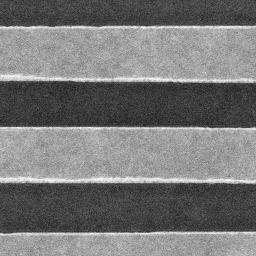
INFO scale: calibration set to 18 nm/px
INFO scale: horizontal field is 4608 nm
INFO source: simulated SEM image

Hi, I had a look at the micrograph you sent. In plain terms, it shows lines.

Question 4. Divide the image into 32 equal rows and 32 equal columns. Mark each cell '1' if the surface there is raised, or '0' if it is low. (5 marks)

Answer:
00000000000000000000000000000000
00000000000000000000000000000000
00000000000000000000000000000000
11111111111111111111111111111111
11111111111111111111111111111111
11111111111111111111111111111111
11111111111111111111111111111111
11111111111111111111111111111111
11111111111111111111111111111111
11111111111111111111111111111111
00000000000000000000000000000000
00000000000000000000000000000000
00000000000000000000000000000000
00000000000000000000000000000000
00000000000000000000000000000000
00000000000000000000000000000000
11111111111111111111111111111111
11111111111111111111111111111111
11111111111111111111111111111111
11111111111111111111111111111111
11111111111111111111111111111111
11111111111111111111111111111111
11111111111111111111111111111111
00000000000000000000000000000000
00000000000000000000000000000000
00000000000000000000000000000000
00000000000000000000000000000000
00000000000000000000000000000000
00000000000000000000000000000000
11111111111111111111111111111111
11111111111111111111111111111111
11111111111111111111111111111111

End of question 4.